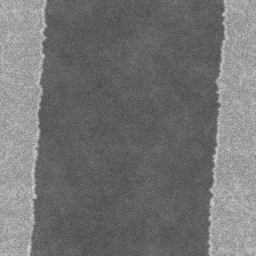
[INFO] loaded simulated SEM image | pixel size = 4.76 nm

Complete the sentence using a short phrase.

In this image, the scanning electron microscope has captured one or a few lines or trenches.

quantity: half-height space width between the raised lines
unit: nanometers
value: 856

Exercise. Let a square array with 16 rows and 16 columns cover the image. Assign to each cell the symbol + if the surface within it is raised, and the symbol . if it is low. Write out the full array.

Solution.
+++...........++
+++...........++
+++...........++
+++...........++
+++...........++
+++...........++
++............++
++............++
++............++
++............++
++...........+++
++...........+++
++...........+++
++...........+++
++...........+++
++...........+++